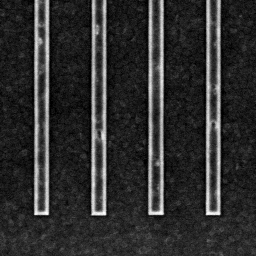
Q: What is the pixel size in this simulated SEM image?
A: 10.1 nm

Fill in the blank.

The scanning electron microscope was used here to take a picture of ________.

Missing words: parallel lines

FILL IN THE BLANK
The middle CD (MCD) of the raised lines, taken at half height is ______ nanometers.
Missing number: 131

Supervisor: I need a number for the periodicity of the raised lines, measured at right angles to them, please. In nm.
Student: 576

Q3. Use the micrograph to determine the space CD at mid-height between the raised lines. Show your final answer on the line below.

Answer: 448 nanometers